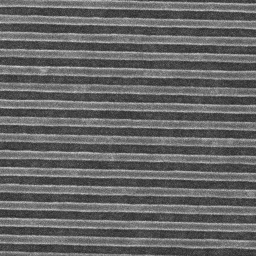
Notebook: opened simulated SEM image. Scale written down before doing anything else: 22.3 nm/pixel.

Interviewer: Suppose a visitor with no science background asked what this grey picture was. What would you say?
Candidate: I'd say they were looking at parallel lines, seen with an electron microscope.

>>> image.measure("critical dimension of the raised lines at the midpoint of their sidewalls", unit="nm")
172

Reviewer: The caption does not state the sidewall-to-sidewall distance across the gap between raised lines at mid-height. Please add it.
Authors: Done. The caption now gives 217 nanometers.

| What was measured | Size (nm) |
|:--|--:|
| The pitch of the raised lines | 377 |